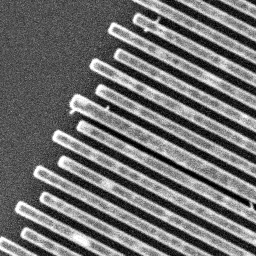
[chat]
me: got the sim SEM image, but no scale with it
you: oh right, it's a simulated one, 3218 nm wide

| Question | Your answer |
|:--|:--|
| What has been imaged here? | parallel lines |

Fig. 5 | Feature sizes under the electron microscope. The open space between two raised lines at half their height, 0.122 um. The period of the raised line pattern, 253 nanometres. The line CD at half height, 122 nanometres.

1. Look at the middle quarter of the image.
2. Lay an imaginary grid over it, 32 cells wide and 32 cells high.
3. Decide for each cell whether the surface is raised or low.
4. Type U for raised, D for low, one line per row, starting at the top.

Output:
DDDDDDDUUUUDDDDDDUUUUUDDDDDDUUUU
DDDDDDDDUUUUUDDDDDDUUUUUDDDDDDUU
DDDDDDDDDDUUUUUDDDDDDUUUUUDDDDDD
DDDDDDDDDDDUUUUUDDDDDDUUUUUUDDDD
DDDDDDDDDDDDDUUUUUDDDDDDUUUUUDDD
DDDDDDDDDUDDDDDUUUUUDDDDDDUUUUUD
DDDDDDDDUUUUDDDDDUUUUUDDDDDDUUUU
DDDDDDDDDUUUUUDDDDDUUUUUDDDDDDUU
DDDUDDDDDDUUUUUUDDDDDUUUUUDDDDDD
DDUUUUDDDDDDUUUUUDDDDDDUUUUUDDDD
DDUUUUUUDDDDDDUUUUUDDDDDDUUUUUDD
DDUUUUUUUUUDDDDDUUUUUDDDDDDUUUUU
DDDDDDUUUUUUDDDDDDUUUUUDDDDDDUUU
DDDDDDDUUUUUUUDDDDDDUUUUUDDDDDDU
DDDDUDDDDUUUUUUUDDDDDDUUUUUDDDDD
DDDDUUUDDDDUUUUUUUDDDDDDUUUUUDDD
DDDDUUUUUDDDDUUUUUUUDDDDDDUUUUUD
DDDDDDUUUUUDDDDUUUUUUUDDDDDDUUUU
UUDDDDDDUUUUUDDDDUUUUUUUDDDDDUUU
UUUDDDDDDUUUUUUDDDDUUUUUUUDDDDDU
UUUUUDDDDDDUUUUUDDDDDUUUUUUDDDDD
DDUUUUUDDDDDDUUUUUDDDDDUUUUUUDDD
DDDDUUUUUDDDDDDUUUUUDDDDDUUUUUUD
UDDDDDUUUUUDDDDDDUUUUUDDDDDUUUUU
UUUDDDDDUUUUUDDDDDDUUUUUDDDDUUUU
UUUUDDDDDDUUUUUDDDDDDUUUUUDDDDUU
DUUUUUDDDDDDUUUUUDDDDDDUUUUUDDDD
DDDUUUUUDDDDDDUUUUUDDDDDDUUUUUDD
DDDDDUUUUUDDDDDDUUUUUDDDDDDUUUUU
UDDDDDDUUUUUDDDDDDUUUUUDDDDDDUUU
UUUDDDDDDUUUUUDDDDDDUUUUUDDDDDDU
UUUUUDDDDDDUUUUUDDDDDUUUUUDDDDDD